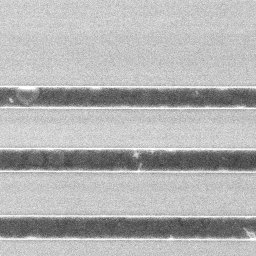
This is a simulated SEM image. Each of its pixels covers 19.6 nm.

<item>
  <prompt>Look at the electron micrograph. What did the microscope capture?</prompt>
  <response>parallel lines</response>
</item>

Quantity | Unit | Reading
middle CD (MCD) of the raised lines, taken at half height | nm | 464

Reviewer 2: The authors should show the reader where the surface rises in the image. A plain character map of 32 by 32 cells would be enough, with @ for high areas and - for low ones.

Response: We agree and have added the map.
--------------------------------
--------------------------------
--------------------------------
--------------------------------
--------------------------------
--------------------------------
--------------------------------
--------------------------------
--------------------------------
--------------------------------
--------------------------------
@@@@@@@@@@@@@@@@@@@@@@@@-@@@@@@@
@-@@@@@@@@@@@@@@@@@@@@@@@@@@@@@@
-----------------@@@@-@@@@@@@@@@
--------------------------------
--------------------------------
--------------------------------
--------------------------------
--------------------------------
@@@@@@@@@@@@@@@@--@@@@@@@@@@@@@@
@@@@@@@@@@@@@@@@@-@@@@@@@@@@@@@@
--------------------------------
--------------------------------
--------------------------------
--------------------------------
--------------------------------
--------------------------------
@@@@@@@@@@@@@@@@@@@@@@@@@@@@@@@@
@@@@@@@@@@@@@@@@@@@@@@@@@@@@@@-@
@@@@@@@@@@@@@@@@@@@@@-@@@@@@@@@-
--------------------------------
--------------------------------